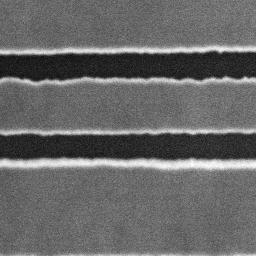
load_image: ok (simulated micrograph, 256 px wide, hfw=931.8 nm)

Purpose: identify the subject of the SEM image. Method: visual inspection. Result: lines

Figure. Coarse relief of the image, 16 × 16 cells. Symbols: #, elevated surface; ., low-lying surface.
################
################
################
................
................
################
################
################
................
................
################
################
################
################
################
################